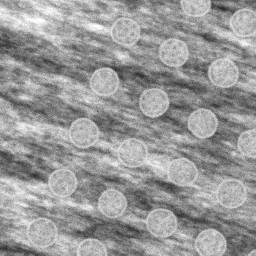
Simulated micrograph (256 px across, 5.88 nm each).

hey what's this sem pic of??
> a regular array of raised bodies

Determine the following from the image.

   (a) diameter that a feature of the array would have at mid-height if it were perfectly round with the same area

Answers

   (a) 167 nm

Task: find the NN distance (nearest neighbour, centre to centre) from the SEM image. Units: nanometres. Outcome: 312